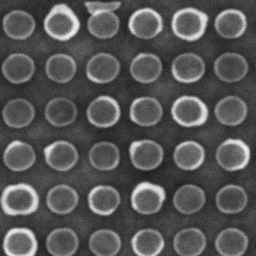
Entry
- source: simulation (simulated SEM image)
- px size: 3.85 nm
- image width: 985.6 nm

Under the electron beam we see a regular array of raised bodies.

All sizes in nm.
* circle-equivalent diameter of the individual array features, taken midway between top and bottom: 117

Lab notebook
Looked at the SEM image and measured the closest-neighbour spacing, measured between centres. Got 41.8 pixels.